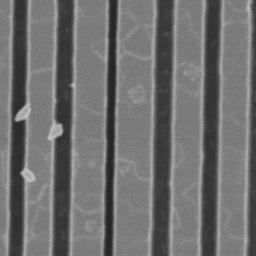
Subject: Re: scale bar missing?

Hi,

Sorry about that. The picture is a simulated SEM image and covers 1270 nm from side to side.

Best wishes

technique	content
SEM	parallel lines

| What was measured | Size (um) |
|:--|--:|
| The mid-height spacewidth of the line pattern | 0.0719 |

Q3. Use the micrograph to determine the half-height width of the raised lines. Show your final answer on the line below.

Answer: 161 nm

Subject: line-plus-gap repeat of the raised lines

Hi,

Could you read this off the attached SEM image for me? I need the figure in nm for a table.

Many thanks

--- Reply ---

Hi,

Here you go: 240